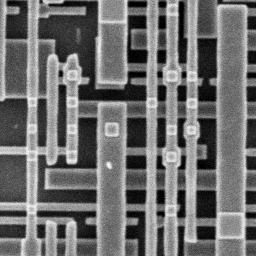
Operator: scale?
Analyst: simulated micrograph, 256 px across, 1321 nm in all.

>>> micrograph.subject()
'wiring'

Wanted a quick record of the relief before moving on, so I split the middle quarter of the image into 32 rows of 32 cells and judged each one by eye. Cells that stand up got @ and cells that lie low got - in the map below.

@@@@-----@@@@@@@-----@@--@@@@--@
@@@@-----@@@@@@@-----@@--@@@@--@
@@@@-----@@@@@@@-----@@--@@@@--@
@@@@-----@@@@@@@-----@@--@@@@--@
@@@@-----@@@@@@@-----@@--@@@@--@
-@@------------------@@---@@---@
-@@------------------@@---@@---@
-@@------------------@@---@@---@
-@@------------------@@---@@---@
-@@------------------@@---@@---@
-@@------@@@@@@@-----@@---@@---@
-@@------@@@@@@@-----@@---@@---@
-@@------@@@@@@@-----@@---@@---@
-@@------@@@@@@@-----@@---@@---@
-@@------@@@@@@@-----@@---@@--@@
-@@-----@@@@@@@@-----@@---@@--@@
-@@-----@@@@@@@@-----@@---@@--@@
-@@-----@@@@@@@@-----@@---@@--@@
-@@-----@@@@@@@@-----@@---@@--@@
-@@-----@@@@@@@@-----@@---@@---@
-@@-----@@@@@@@------@@--@@@---@
-@@-----@@@@@@@------@@--@@@@--@
-@@-----@@@@@@@------@@--@@@@--@
-@@-----@@@@@@@------@@--@@@@--@
-@@-----@@@@@@@------@@--@@@@--@
--------@@@@@@@------@@--@@@@-@@
--------@@@@@@@------@@---@@--@@
--------@@@@@@@------@@--@@@--@@
--------@@@@@@@------@@--@@@--@@
--------@@@@@@@------@@--@@@---@
--------@@@@@@@------@@--@@@---@
--------@@@@@@@------@@--@@@---@